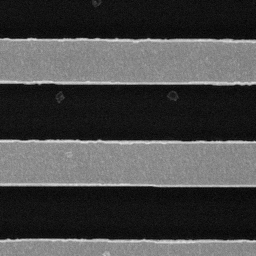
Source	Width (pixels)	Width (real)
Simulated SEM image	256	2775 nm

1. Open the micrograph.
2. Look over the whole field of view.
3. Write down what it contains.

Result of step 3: lines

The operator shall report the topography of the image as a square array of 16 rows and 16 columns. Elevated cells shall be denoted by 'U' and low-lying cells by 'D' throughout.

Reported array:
DDDDDDDDDDDDDDDD
DDDDDDDDDDDDDDDD
UUUUUUUUDUDDUDDD
UUUUUUUUUUUUUUUU
UUUUUUUUUUUUUUUU
DDDDDDDDDDDDDDDD
DDDDDDDDDDDDDDDD
DDDDDDDDDDDDDDDD
DDDDDDDDDDDDDDDD
UUUUUUUUUUUUUUUU
UUUUUUUUUUUUUUUU
UUUUUUUUUUUUUUUU
DDDDDDDDDDDDDDDD
DDDDDDDDDDDDDDDD
DDDDDDDDDDDDDDDD
UUUUUUUUUUUUUUUU